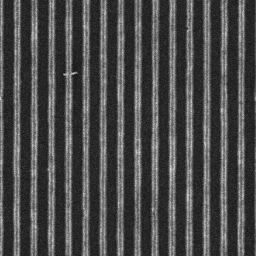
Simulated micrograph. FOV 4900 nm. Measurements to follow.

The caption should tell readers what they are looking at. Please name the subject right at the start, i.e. parallel lines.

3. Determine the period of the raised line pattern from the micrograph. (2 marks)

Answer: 330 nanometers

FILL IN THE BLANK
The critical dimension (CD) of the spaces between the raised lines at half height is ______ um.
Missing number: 0.225